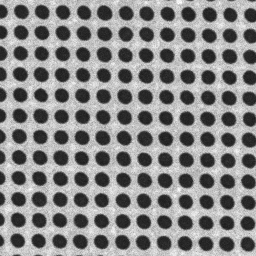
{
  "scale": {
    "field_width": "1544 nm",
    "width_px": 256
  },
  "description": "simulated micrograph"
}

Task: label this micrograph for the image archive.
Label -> a regular array of holes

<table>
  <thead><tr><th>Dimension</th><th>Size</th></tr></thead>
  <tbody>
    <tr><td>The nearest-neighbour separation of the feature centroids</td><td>124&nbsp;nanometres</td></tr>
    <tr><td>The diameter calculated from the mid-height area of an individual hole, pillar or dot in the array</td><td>90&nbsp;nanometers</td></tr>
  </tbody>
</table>